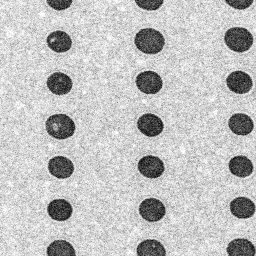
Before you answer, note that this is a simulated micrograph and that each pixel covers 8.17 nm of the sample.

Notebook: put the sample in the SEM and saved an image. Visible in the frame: a regular array of holes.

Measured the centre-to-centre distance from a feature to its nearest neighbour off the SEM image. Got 342 nm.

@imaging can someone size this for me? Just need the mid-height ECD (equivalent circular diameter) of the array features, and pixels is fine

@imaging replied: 26.1